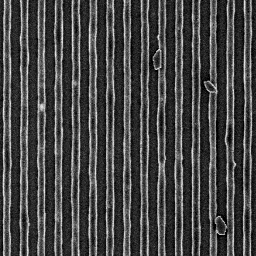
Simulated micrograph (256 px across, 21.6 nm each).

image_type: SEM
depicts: parallel lines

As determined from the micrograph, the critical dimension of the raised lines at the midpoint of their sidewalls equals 154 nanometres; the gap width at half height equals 232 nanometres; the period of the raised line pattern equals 0.371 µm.